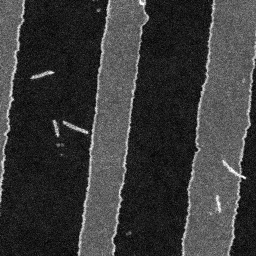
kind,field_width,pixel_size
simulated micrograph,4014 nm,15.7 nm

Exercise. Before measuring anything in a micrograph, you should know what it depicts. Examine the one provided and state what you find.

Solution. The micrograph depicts one or a few lines or trenches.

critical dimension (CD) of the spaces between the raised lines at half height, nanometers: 1090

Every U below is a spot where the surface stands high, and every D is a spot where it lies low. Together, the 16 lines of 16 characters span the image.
UDDDDDDUUDDDDUUU
UDDDDDDUUDDDDUUU
UDDDDDUUUDDDDUUU
UDDDDDUUUDDDDUUU
UDDDDDUUUDDDDUUU
UDDDDDUUDDDDDUUU
UDDDDDUUDDDDUUUU
UDDDDDUUDDDDUUUU
DDDDDDUUDDDDUUUD
DDDDDDUUDDDDUUUD
DDDDDDUUDDDDUUUD
DDDDDDUUDDDDUUUD
DDDDDUUUDDDDUUUD
DDDDDUUDDDDDUUUD
DDDDDUUDDDDDUUUD
DDDDDUUDDDDUUUDD